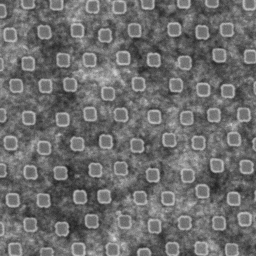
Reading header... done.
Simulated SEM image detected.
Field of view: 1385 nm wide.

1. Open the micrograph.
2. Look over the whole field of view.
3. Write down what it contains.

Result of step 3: a regular array of raised bodies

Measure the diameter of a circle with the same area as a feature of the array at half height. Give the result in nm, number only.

75.5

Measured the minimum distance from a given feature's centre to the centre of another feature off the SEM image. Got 147 nm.